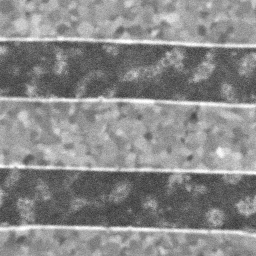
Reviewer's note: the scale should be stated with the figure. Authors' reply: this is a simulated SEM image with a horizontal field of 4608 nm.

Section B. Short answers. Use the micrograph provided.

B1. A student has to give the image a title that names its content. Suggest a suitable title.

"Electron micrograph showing one or a few lines or trenches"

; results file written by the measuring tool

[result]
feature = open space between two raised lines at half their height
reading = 1080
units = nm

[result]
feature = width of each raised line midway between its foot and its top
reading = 1210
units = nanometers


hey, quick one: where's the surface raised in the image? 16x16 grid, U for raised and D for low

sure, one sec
UUUUUUUUUUUUUUUU
UUUUUUUUUUUUUUUU
DDDDDDUUUUUUUUUU
DDDDDDDDDDDDDDDD
DDDDDDDDDDDDDDDD
DDDDDDDDDDDDDDDD
UUUUUUUUUUUUUDDD
UUUUUUUUUUUUUUUU
UUUUUUUUUUUUUUUU
UUUUUUUUUUUUUUUU
DDDDUUUUUUUUUUUU
DDDDDDDDDDDDDDDD
DDDDDDDDDDDDDDDD
DDDDDDDDDDDDDDDD
UUUUUUUUUUUUUUDD
UUUUUUUUUUUUUUUU